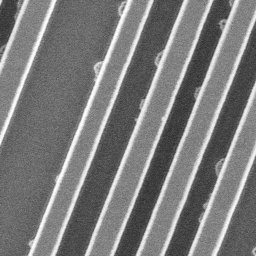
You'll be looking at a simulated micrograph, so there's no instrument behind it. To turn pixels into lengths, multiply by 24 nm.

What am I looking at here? lines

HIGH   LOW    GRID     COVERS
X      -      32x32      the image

---XXXX---------XXX----XXX---XXX
--XXXX---------XXXX---XXXX---XXX
--XXXX---------XXX----XXXX--XXXX
--XXXX---------XXX----XXX---XXXX
-XXXX---------XXX----XXXX---XXX-
-XXXX---------XXX----XXX---XXXX-
-XXX---------XXXX----XXX---XXX--
XXXX---------XXX----XXXX--XXXX--
XXXX---------XXX----XXX---XXXX--
XXX---------XXX----XXXX---XXX---
XXX---------XXX----XXXX--XXXX---
XX----------XXX----XXX---XXX---X
XX---------XXX----XXXX---XXX---X
XX---------XXX----XXX---XXXX---X
X---------XXXX---XXXX---XXX---XX
X---------XXX----XXXX--XXXX---XX
X---------XXX----XXX---XXX----XX
---------XXX----XXXX---XXX---XXX
---------XXX----XXX---XXXX---XXX
--------XXXX---XXXX---XXX---XXXX
--------XXX----XXXX--XXXX---XXX-
--------XXX----XXX---XXX----XXX-
-------XXX----XXXX---XXX---XXXX-
-------XXX----XXXX--XXXX---XXX--
-------XXX---XXXX---XXX---XXXX--
------XXX----XXXX---XXX---XXXX--
------XXX----XXX---XXXX---XXX---
-----XXXX---XXXX---XXX---XXXX---
-----XXX----XXXX--XXXX---XXX----
-----XXX----XXX---XXX---XXXX----
----XXX----XXXX---XXX---XXXX----
----XXX----XXX---XXXX---XXX-----